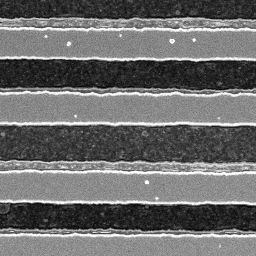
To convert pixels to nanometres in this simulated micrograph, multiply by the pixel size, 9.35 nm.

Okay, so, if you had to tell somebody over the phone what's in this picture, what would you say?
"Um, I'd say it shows lines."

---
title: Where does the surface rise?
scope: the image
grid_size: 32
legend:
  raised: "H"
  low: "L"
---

LLLLLLLLLLLLLLLLLLLLLLLLLLLLLLLL
LLLLLLLLLLLLLLLLLLLLLLLLLLLLLLLL
HHHHHHHHHHHHHHHHHHHHHHHHHHHLLHHL
HHHHHHHHHHHHHHHHHHHHHHHHHHHHHHHH
HHHHHHHHHHHHHHHHHHHHHHHHHHHHHHHH
HHHHHHHHHHHHHHHHHHHHHHHHHHHHHHHH
HHHHHHHHHHHHHHHHHHHHHHHHHHHHHHHH
LLLLLLLLLLLLLHHHHLLHHLHHHHHHLHHH
LLLLLLLLLLLLLLLLLLLLLLLLLLLLLLLL
LLLLLLLLLLLLLLLLLLLLLLLLLLLLLLLL
LLLLLLLLLLLLLLLLLLLLLLLLLLLLLLLL
HHHHHHHHHHHHHHHHHHHHHHHHHHHHHHHH
HHHHHHHHHHHHHHHHHHHHHHHHHHHHHHHH
HHHHHHHHHHHHHHHHHHHHHHHHHHHHHHHH
HHHHHHHHHHHHHHHHHHHHHHHHHHHHHHHH
HHHHHHHHHHHHHHHHHHHHHHHHHHHHHHHH
LLLLLLLLLLLLLLLLLLLLLLLLLLLLLLLL
LLLLLLLLLLLLLLLLLLLLLLLLLLLLLLLL
LLLLLLLLLLLLLLLLLLLLLLLLLLLLLLLL
LLLLLLLLLLLLLLLLLLLLLLLLLLLLLLLL
HHHHHHHHHHHHHHHHHHHHHHHHHHLLLLHL
HHHHHHHHHHHHHHHHHHHHHHHHHHHHHHHH
HHHHHHHHHHHHHHHHHHHHHHHHHHHHHHHH
HHHHHHHHHHHHHHHHHHHHHHHHHHHHHHHH
HHHHHHHHHHHHHHHHHHHHHHHHHHHHHHHH
LLLLLLLLLLLLLLLLLLLHHHLHHLLLLLHH
LLLLLLLLLLLLLLLLLLLLLLLLLLLLLLLL
LLLLLLLLLLLLLLLLLLLLLLLLLLLLLLLL
LLLLLLLLLLLLLLLLLLLLLLLLLLLLLLLL
HHHHHHHHHHHHHHHHHHHHHHHHHHHHHHHH
HHHHHHHHHHHHHHHHHHHHHHHHHHHHHHHH
HHHHHHHHHHHHHHHHHHHHHHHHHHHHHHHH